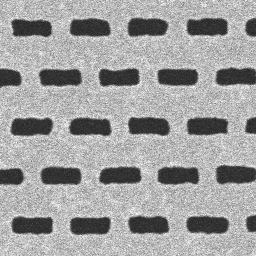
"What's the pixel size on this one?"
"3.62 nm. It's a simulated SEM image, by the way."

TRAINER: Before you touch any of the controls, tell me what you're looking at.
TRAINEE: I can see a regular array of holes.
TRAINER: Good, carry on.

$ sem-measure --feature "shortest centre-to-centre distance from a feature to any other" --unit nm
206